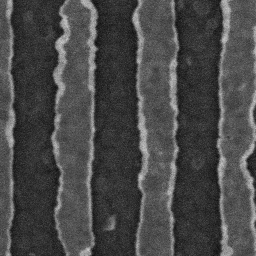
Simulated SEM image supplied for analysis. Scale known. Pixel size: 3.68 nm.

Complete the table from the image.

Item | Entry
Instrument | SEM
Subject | one or a few lines or trenches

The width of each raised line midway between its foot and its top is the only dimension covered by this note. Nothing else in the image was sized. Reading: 129 nm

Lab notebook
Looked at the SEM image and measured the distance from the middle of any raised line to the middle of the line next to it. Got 0.296 micrometres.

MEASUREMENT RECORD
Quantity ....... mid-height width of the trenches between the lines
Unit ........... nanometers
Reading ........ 169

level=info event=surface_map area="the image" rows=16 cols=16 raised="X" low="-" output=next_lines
X---XX---XX---XX
X---XX--XXX---XX
X---XX---XX---XX
X---XX---XX---XX
X--XXX---XX---XX
X---XX---XX---XX
X---XX---XX---XX
X--XXX---XX---XX
X--XXX---XX---XX
X--XXX---XX---XX
X---XX---XX---X-
X---XX---XX---XX
X---XX---XX---XX
X--XXX---XX---XX
X---XX---XX---XX
X---XX---XX---XX